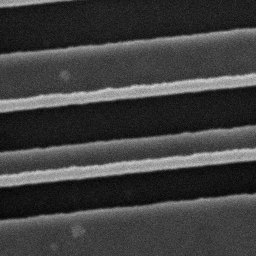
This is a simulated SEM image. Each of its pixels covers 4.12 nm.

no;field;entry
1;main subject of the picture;lines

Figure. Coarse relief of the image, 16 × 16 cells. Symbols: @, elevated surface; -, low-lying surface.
----------------
----------------
---------@@@@@@@
@@@@@@@@@@@@@@@@
@@@@@@@@@@@@@@@@
@@@@@@@@@@@@@@--
@@@@@-----------
----------------
----------@@@@@@
-@@@@@@@@@@@@@@@
@@@@@@@@@@@-----
@---------------
------------@@@@
---@@@@@@@@@@@@@
@@@@@@@@@@@@@@@@
@@@@@@@@@@@@@@@@